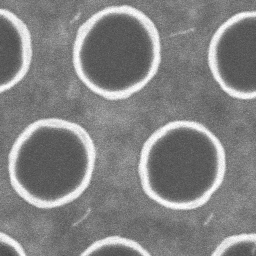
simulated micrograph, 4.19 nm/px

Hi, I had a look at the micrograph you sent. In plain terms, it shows raised bodies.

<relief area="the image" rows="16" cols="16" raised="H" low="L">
LLLLLLLLLLLLLLLL
HLLLLLHHHLLLLLHH
HHLLLHHHHHLLLHHH
HHLLLHHHHHLLLHHH
HLLLLHHHHLLLLHHH
LLLLLLHHLLLLLLHH
LLLLLLLLLLLLLLLL
LLLLLLLLLLLLLLLL
LHHHHLLLLLHHHLLL
LHHHHHLLLHHHHHLL
LHHHHHLLLHHHHHLL
LHHHHLLLLHHHHHLL
LLHHLLLLLLHHHLLL
LLLLLLLLLLLLLLLL
LLLLLLLLLLLLLLLL
HLLLLLHHHLLLLLHH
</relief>